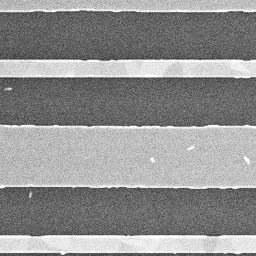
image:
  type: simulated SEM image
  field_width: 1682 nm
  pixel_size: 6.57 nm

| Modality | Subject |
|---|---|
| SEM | lines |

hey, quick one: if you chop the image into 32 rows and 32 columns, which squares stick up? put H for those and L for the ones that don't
HHHHHHHHHHHHHHHHHHHHHHHHHHHHHHHH
LLLLLLLLLLLLLLLLLLLLLLLLLLLLLLLL
LLLLLLLLLLLLLLLLLLLLLLLLLLLLLLLL
LLLLLLLLLLLLLLLLLLLLLLLLLLLLLLLL
LLLLLLLLLLLLLLLLLLLLLLLLLLLLLLLL
LLLLLLLLLLLLLLLLLLLLLLLLLLLLLLLL
LLLLLLLLLLLLLLLLLLLLLLLLLLLLLLLL
LLLLLLLLLLLLLLLLLLLLLLLLLLLLLLLL
HHHHHHHHHHHHHHHHHHHHHHHHHHHHHHHH
HHHHHHHHHHHHHHHHHHHHHHHHHHHHHHHH
LLLLLLLLLLLLLLLLLLLLLLLLLLLLLLLL
LLLLLLLLLLLLLLLLLLLLLLLLLLLLLLLL
LLLLLLLLLLLLLLLLLLLLLLLLLLLLLLLL
LLLLLLLLLLLLLLLLLLLLLLLLLLLLLLLL
LLLLLLLLLLLLLLLLLLLLLLLLLLLLLLLL
LLLLLLLLLLLLLLLLLLLLLLLLLLLLLLLL
HHHHHHHHHHHHHHHHHHHHHHHHHHHHHHHH
HHHHHHHHHHHHHHHHHHHHHHHHHHHHHHHH
HHHHHHHHHHHHHHHHHHHHHHHHHHHHHHHH
HHHHHHHHHHHHHHHHHHHHHHHHHHHHHHHH
HHHHHHHHHHHHHHHHHHHHHHHHHHHHHHHH
HHHHHHHHHHHHHHHHHHHHHHHHHHHHHHHH
HHHHHHHHHHHHHHHHHHHHHHHHHHHHHHHH
LLLLLLLLLLLLLLLLLLLLLLLLLLLLLLLL
LLLLLLLLLLLLLLLLLLLLLLLLLLLLLLLL
LLLLLLLLLLLLLLLLLLLLLLLLLLLLLLLL
LLLLLLLLLLLLLLLLLLLLLLLLLLLLLLLL
LLLLLLLLLLLLLLLLLLLLLLLLLLLLLLLL
LLLLLLLLLLLLLLLLLLLLLLLLLLLLLLLL
LLLLLLLLLLLLLLLLLLLLLLLLLLLLLLLL
HHHHHHHHHHHHHHHHHHHHHHHHHHHHHHHH
HHHHHHHHHHHHHHHHHHHHHHHHHHHHHHHH